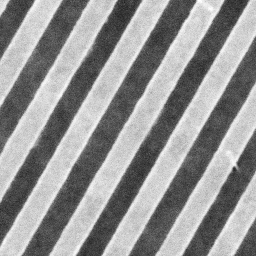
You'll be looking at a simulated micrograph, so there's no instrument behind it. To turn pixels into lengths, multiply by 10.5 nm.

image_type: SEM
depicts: lines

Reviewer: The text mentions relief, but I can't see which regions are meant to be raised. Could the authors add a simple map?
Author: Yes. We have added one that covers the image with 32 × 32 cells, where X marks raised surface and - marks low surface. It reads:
X---XXX----XXX----XXX---XXXX---X
----XXX---XXXX---XXX----XXX---XX
---XXX----XXX---XXXX---XXXX---XX
--XXXX---XXXX---XXX----XXX---XXX
--XXX----XXX---XXXX---XXX----XXX
-XXXX---XXX----XXX---XXXX---XXX-
-XXX----XXX---XXX----XXX----XXX-
XXX----XXX----XXX---XXXX---XXX--
XXX---XXXX---XXX----XXX---XXXX--
XX----XXX---XXXX---XXXX---XXX---
XX---XXXX---XXX----XXX---XXX----
X----XXX---XXX----XXX----XXX---X
----XXX----XXX---XXXX---XXX----X
---XXXX---XXX----XXX---XXXX---XX
---XXX---XXXX---XXXX---XXX----XX
--XXXX---XXX----XXX---XXXX---XXX
--XXX---XXXX---XXX----XXX---XXXX
-XXX----XXX----XXX---XXX----XXX-
-XXX---XXX----XXX----XXX---XXXX-
XXX----XXX---XXXX---XXX----XXX--
XXX---XXX----XXX---XXXX---XXX---
XX---XXXX---XXXX---XXX----XXX---
XX---XXX----XXX---XXX----XXX---X
X---XXXX---XXX----XXX---XXXX---X
----XXX----XXX---XXX----XXX---XX
---XXX----XXX----XXX---XXX----XX
---XXX---XXXX---XXX----XXX---XXX
--XXX----XXX---XXXX---XXX----XXX
-XXXX---XXXX---XXX----XXX---XXX-
-XXX----XXX---XXX----XXX---XXXX-
XXX----XXX----XXX---XXXX---XXX--
XXX---XXXX---XXX----XXX---XXX---